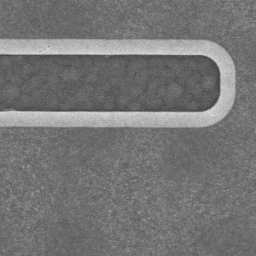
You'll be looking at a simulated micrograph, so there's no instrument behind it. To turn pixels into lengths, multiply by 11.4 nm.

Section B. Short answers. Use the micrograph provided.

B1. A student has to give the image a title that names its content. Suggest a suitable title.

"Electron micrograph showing one or a few lines or trenches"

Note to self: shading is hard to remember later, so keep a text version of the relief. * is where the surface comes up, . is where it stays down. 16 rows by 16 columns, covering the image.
****************
****************
****************
..............**
..............**
..............**
..............**
****************
****************
****************
****************
****************
****************
****************
****************
****************